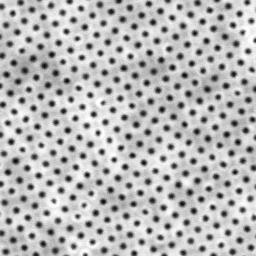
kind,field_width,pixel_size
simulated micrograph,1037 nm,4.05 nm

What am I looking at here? a regular array of holes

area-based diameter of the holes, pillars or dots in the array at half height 30.3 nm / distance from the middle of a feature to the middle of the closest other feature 53.3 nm